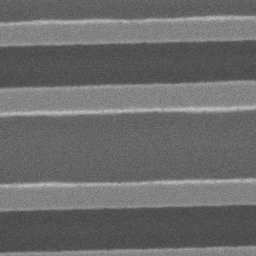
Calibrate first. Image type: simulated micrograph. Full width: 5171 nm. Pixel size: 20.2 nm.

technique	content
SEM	lines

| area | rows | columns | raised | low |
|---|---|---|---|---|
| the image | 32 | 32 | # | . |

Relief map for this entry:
................................
................................
..........................######
################################
################################
########........................
................................
................................
................................
................................
.........................#######
################################
################################
######################..........
................................
................................
................................
................................
................................
................................
................................
................................
................................
################################
################################
################################
................................
................................
................................
................................
................................
............####################